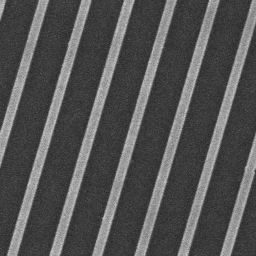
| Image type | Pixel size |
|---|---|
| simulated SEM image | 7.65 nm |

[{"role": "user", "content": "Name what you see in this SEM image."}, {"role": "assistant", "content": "parallel lines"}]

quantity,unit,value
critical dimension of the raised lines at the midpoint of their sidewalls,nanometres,68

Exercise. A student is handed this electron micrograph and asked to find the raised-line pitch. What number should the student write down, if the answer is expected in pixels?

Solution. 41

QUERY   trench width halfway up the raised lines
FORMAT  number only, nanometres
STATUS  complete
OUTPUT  245